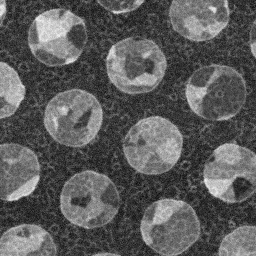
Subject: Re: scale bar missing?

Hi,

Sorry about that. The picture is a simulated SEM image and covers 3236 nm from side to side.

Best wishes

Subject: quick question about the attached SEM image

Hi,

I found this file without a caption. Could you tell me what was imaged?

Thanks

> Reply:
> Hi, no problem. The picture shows raised bodies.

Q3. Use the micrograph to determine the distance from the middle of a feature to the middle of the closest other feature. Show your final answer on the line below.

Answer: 1040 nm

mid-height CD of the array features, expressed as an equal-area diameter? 721 nm